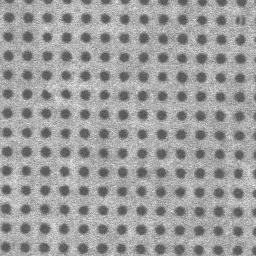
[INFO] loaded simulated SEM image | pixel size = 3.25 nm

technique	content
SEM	a regular array of holes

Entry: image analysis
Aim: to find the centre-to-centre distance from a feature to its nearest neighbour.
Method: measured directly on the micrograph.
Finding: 61.8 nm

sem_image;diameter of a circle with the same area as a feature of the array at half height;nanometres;34.4